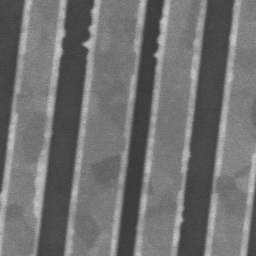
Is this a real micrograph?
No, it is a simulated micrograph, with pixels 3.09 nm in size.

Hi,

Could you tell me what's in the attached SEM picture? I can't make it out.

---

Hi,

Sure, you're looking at one or a few lines or trenches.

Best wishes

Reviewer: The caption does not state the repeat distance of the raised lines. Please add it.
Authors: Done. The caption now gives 0.212 um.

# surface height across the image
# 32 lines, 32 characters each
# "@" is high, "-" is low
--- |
---@@@@@----@@@@@@---@@@@@---@@@
---@@@@@---@@@@@@@--@@@@@@---@@@
---@@@@@----@@@@@@--@@@@@----@@@
---@@@@@---@@@@@@@--@@@@@----@@@
---@@@@@---@@@@@@@--@@@@@----@@@
---@@@@@---@@@@@@@--@@@@@----@@@
--@@@@@@---@@@@@@---@@@@@----@@@
--@@@@@----@@@@@@---@@@@@----@@@
--@@@@@----@@@@@@---@@@@@---@@@@
--@@@@@----@@@@@@--@@@@@@---@@@@
--@@@@@----@@@@@@--@@@@@----@@@@
--@@@@@----@@@@@@--@@@@@----@@@@
--@@@@@----@@@@@@--@@@@@----@@@@
--@@@@@---@@@@@@@--@@@@@----@@@@
-@@@@@----@@@@@@---@@@@@----@@@@
-@@@@@----@@@@@@---@@@@@----@@@@
-@@@@@----@@@@@@---@@@@@---@@@@@
-@@@@@----@@@@@@---@@@@@---@@@@@
-@@@@@----@@@@@@--@@@@@@---@@@@@
-@@@@@----@@@@@@--@@@@@@---@@@@@
-@@@@@----@@@@@@--@@@@@----@@@@@
-@@@@@---@@@@@@@--@@@@@----@@@@@
-@@@@@---@@@@@@@--@@@@@----@@@@@
@@@@@----@@@@@@---@@@@@----@@@@@
@@@@@----@@@@@@---@@@@@----@@@@@
@@@@@----@@@@@@---@@@@@---@@@@@-
@@@@@----@@@@@@--@@@@@@---@@@@@-
@@@@@----@@@@@@--@@@@@@---@@@@@-
@@@@@----@@@@@@--@@@@@----@@@@@-
@@@@@----@@@@@@--@@@@@----@@@@@-
@@@@@---@@@@@@@--@@@@@----@@@@@-
@@@@----@@@@@@---@@@@@----@@@@@-